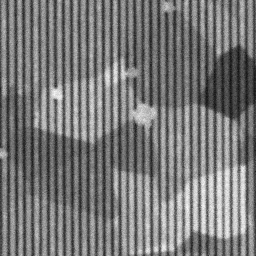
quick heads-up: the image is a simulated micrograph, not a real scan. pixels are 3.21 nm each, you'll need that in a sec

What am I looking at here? parallel lines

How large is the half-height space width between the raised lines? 11.7 nm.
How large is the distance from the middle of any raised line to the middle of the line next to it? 25.6 nanometres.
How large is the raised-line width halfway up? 14.9 nm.